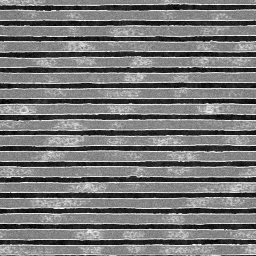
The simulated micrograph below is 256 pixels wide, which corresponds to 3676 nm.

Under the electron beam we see parallel lines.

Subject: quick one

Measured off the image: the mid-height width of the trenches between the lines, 84.4 nm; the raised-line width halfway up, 9.87 pixels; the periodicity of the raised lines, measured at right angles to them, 225 nm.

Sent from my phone